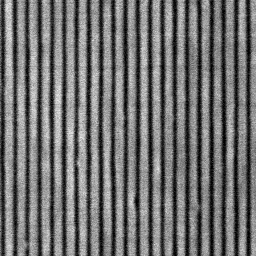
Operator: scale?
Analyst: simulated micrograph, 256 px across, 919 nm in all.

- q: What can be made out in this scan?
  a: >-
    parallel lines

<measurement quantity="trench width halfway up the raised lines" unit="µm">0.0197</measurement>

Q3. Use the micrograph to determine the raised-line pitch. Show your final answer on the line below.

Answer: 44.1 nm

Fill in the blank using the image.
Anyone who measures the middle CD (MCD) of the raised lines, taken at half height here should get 23.3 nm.